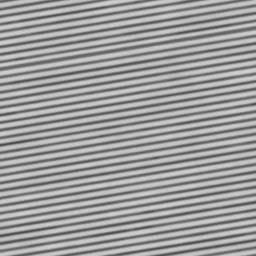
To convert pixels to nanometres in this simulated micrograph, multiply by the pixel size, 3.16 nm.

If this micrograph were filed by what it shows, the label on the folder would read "parallel lines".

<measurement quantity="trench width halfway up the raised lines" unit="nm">8.6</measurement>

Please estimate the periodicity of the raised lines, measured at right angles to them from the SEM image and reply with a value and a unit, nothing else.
0.0236 um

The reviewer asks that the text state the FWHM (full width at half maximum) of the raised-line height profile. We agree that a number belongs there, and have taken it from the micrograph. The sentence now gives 13.6 nanometres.